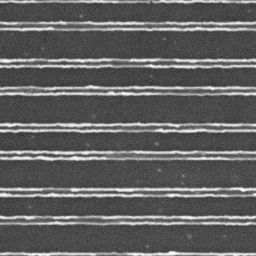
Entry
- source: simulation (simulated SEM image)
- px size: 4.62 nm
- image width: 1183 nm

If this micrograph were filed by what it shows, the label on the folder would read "parallel lines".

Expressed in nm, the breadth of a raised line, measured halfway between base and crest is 36.4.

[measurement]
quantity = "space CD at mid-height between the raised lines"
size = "112 nanometres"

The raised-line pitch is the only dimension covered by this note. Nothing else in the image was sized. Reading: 149 nm